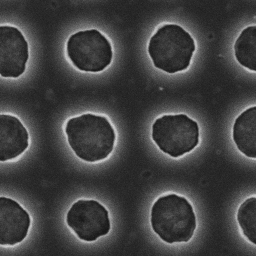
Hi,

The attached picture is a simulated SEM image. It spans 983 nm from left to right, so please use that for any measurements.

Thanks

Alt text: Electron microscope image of holes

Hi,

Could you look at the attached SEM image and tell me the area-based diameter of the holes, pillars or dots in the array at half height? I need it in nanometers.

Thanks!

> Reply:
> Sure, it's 176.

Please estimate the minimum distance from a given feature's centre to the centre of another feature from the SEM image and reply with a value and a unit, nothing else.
320 nanometers